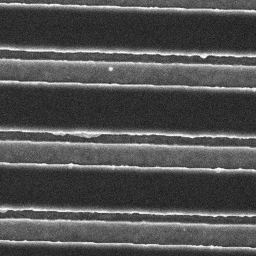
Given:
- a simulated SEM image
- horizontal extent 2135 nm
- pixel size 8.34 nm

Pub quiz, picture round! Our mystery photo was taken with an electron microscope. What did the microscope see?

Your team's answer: lines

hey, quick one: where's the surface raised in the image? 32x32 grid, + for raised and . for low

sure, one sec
+++.............................
++++++++++++++++++++++++++++++++
++++++++++++++++++++++++++++++++
++++++++++++++++++++++++++++++++
++++++++++++++++++++++++++++++++
++++++++++++++++++++++++++++++++
.............+++++++++++++++++++
................................
................................
................................
++++++++++......................
++++++++++++++++++++++++++++++++
++++++++++++++++++++++++++++++++
++++++++++++++++++++++++++++++++
++++++++++++++++++++++++++++++++
++++++++++++++++++++++++++++++++
......++++++++++++++++++++++++++
................................
................................
................................
+...............................
++++++++++++++++++++++++++++++++
++++++++++++++++++++++++++++++++
++++++++++++++++++++++++++++++++
++++++++++++++++++++++++++++++++
++++++++++++++++++++++++++++++++
...........+++++++++++++++++++++
................................
................................
................................
+++++++++++++++++...............
++++++++++++++++++++++++++++++++